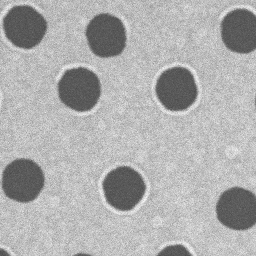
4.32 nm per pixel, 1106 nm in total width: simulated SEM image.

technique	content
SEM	holes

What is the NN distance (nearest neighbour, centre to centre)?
368 nm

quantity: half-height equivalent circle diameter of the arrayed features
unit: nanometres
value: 186